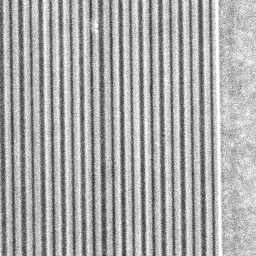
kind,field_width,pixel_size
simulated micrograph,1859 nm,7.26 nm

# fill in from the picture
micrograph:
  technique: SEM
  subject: parallel lines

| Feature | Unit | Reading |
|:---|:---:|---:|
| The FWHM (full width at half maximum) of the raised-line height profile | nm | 39.9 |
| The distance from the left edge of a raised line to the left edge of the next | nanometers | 71.9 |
